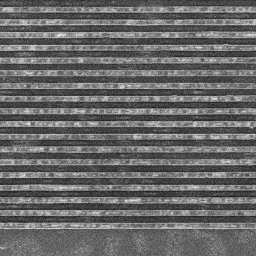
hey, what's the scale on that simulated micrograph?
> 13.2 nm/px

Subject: parallel lines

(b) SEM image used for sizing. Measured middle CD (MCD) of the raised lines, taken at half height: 0.0777 micrometres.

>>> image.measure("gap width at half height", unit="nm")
99.2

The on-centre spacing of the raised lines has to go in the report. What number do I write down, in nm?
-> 168